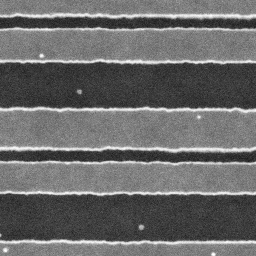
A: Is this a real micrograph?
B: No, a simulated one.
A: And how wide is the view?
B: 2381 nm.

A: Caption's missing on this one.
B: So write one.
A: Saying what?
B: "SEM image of lines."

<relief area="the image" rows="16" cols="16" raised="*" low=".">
****************
****************
****************
****************
................
................
................
****************
****************
****************
****************
****************
................
................
................
****************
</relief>